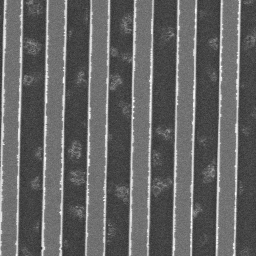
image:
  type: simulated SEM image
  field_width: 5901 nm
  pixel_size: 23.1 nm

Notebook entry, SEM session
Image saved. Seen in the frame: parallel lines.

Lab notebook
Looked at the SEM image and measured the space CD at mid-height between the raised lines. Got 576 nanometres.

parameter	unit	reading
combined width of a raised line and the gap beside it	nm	1000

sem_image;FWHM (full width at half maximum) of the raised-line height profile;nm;429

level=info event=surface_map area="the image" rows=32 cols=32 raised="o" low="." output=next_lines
.oo...oo...ooo...oo...oo....oo..
.oo...oo...ooo...oo...oo....oo..
.oo...oo...ooo...oo...oo....oo..
.oo...oo...ooo...oo...oo....oo..
.oo...oo...ooo...oo...oo....oo..
ooo...oo...ooo...oo...oo....oo..
ooo...oo...ooo...oo...oo....oo..
ooo...oo...oo....oo...oo....oo..
ooo...oo...ooo...oo...oo....oo..
ooo...oo...ooo...oo...oo....oo..
ooo...oo...ooo...oo...oo....oo..
ooo...oo...oo....oo...oo....oo..
oo....oo...oo....oo...oo...ooo..
oo....oo...oo....oo...oo...ooo..
oo....oo...oo....oo...oo...ooo..
oo....oo...oo....oo...oo...ooo..
oo....oo...oo....oo...oo...ooo..
oo....oo...oo...ooo...oo...ooo..
oo....oo...oo...ooo...oo...ooo..
oo....oo...oo...ooo...oo...ooo..
oo....oo...oo...ooo...oo...ooo..
oo...ooo...oo...ooo...oo...ooo..
oo...ooo...oo...ooo...oo...oo...
oo...ooo...oo...ooo...oo...oo...
oo...ooo...oo...ooo...oo...oo...
oo...ooo...oo...ooo...oo...oo...
oo...ooo...oo...ooo...oo...oo...
oo...ooo...oo...ooo...oo...oo...
oo...ooo...oo...ooo...oo...oo...
oo...ooo...oo...ooo...oo...oo...
oo...ooo...oo...ooo...oo...oo...
oo...ooo...oo...ooo...oo...oo...